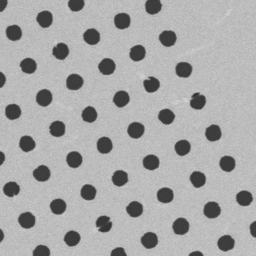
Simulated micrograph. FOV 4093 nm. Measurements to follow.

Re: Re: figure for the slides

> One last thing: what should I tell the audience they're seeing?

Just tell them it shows a regular array of holes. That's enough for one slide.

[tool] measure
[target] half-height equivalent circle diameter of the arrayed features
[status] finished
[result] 0.263 micrometres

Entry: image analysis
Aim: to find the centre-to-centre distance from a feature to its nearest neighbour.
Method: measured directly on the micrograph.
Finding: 538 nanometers